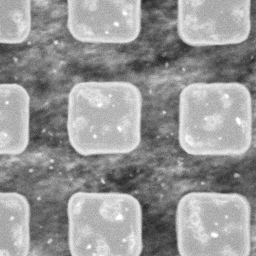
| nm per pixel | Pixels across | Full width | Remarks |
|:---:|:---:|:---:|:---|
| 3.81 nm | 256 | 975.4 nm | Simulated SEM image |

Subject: raised bodies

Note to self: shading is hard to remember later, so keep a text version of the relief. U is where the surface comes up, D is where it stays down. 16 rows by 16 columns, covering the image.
UUDDUUUUUDDUUUUU
UUDDUUUUUDDUUUUU
UDDDDUUUDDDDUUUD
DDDDDDDDDDDDDDDD
DDDDDDDDDDDDDDDD
UDDDDUUUDDDDUUUD
UUDDUUUUUDDUUUUU
UUDDUUUUUDDUUUUU
UUDDUUUUUDDUUUUU
UDDDDUUUDDDDUUUD
DDDDDDDDDDDDDDDD
DDDDDDDDDDDDDDDD
UUDDUUUUDDDUUUUD
UUDDUUUUUDDUUUUU
UUDDUUUUUDDUUUUU
UUDDUUUUUDDUUUUU